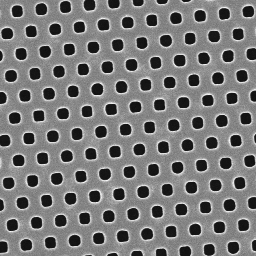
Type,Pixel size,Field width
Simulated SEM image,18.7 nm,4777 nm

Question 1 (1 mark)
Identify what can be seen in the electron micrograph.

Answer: a regular array of holes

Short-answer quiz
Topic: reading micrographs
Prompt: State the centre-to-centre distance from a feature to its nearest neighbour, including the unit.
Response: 450 nanometers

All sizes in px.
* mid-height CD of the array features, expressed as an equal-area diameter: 12.3